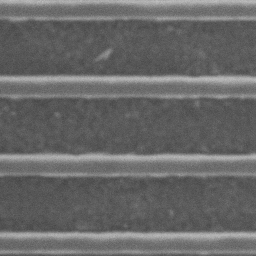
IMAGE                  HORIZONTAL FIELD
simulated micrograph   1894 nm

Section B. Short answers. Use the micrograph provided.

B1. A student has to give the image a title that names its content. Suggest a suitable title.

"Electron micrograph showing lines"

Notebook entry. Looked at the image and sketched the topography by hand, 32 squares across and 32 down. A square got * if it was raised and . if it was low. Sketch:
********************************
********************************
................................
................................
................................
................................
................................
................................
................................
................................
********************************
********************************
................................
................................
................................
................................
................................
................................
................................
*********.********.****.****.***
********************************
********************************
................................
................................
................................
................................
................................
................................
................................
********************************
********************************
********************************